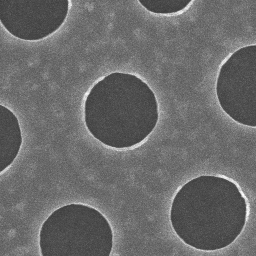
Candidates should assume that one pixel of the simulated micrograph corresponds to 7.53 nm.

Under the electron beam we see holes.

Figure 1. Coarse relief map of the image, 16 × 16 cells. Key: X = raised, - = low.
----XXXXX--XXXXX
----XXXXXXXXXXXX
XXXXXXXXXXXXXXXX
XXXXXXXXXXXXXX--
XXXXXXXXXXXXXX--
XXXXXX---XXXXX--
XXXXX-----XXXX--
-XXXX-----XXXXX-
-XXXXX---XXXXXXX
-XXXXXXXXXXXXXXX
XXXXXXXXXXXXXXXX
XXXXXXXXXXXX---X
XXXXXXXXXXX----X
XXX---XXXXX----X
XXX----XXXX----X
XXX----XXXXX--XX